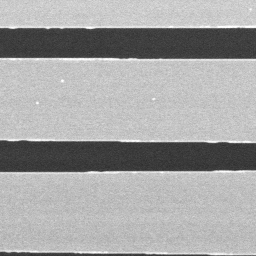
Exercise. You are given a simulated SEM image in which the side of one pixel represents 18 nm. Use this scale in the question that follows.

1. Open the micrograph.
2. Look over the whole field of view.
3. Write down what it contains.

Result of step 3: lines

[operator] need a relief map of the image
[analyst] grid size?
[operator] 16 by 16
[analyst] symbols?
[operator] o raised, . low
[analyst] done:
oooooooooooooooo
oooooooooooooooo
................
................
oooooooooooooooo
oooooooooooooooo
oooooooooooooooo
oooooooooooooooo
oooooooooooooooo
................
................
oooooooooooooooo
oooooooooooooooo
oooooooooooooooo
oooooooooooooooo
oooooooooooooooo